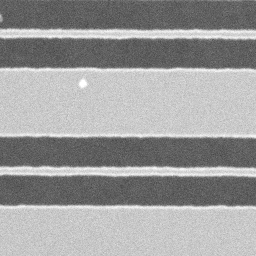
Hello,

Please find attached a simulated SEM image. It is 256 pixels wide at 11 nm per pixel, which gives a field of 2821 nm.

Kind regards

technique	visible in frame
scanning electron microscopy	lines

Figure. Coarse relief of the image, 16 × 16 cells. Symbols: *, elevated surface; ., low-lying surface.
................
................
................
................
****************
****************
****************
****************
*..*************
................
................
................
................
****************
****************
****************